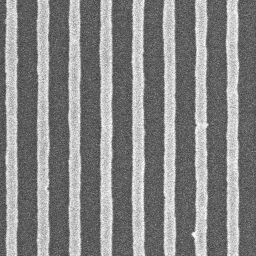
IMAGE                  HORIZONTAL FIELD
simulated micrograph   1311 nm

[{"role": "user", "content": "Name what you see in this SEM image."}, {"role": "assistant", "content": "parallel lines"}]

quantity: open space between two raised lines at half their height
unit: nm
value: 108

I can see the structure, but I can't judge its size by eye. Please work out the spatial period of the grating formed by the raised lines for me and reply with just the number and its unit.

0.162 microns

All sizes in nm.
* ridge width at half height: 56.3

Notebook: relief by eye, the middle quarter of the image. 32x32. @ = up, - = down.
-@@@-----@@@-----@@@-----@@@----
-@@@-----@@@-----@@@-----@@@----
-@@@-----@@@-----@@@-----@@@----
-@@@-----@@@-----@@@-----@@@----
-@@@-----@@@-----@@@-----@@@----
-@@@-----@@@-----@@@-----@@@----
-@@@-----@@@-----@@@-----@@@----
-@@@-----@@@-----@@@-----@@@----
-@@@-----@@@-----@@@-----@@@----
-@@@-----@@@-----@@@-----@@@----
-@@@-----@@@-----@@@-----@@@----
-@@@-----@@@-----@@@-----@@@----
-@@@-----@@@-----@@@-----@@@----
-@@@-----@@@-----@@@-----@@@----
-@@@-----@@@-----@@@-----@@-----
-@@@-----@@@-----@@@-----@@-----
-@@@-----@@@-----@@@-----@@@----
-@@@-----@@@-----@@@-----@@@----
-@@@-----@@@-----@@@-----@@@----
-@@@-----@@@-----@@@-----@@@----
-@@@-----@@@-----@@@-----@@@----
-@@@-----@@@-----@@@-----@@@----
-@@@-----@@@-----@@@-----@@@----
-@@@-----@@@-----@@@-----@@@----
-@@@-----@@@-----@@@-----@@-----
-@@@-----@@@-----@@@-----@@@----
-@@@-----@@@-----@@@-----@@@----
-@@@-----@@@-----@@@-----@@@----
-@@@-----@@@-----@@@-----@@@----
-@@@-----@@@-----@@@-----@@@----
-@@@-----@@@-----@@@-----@@-----
-@@@-----@@@-----@@@-----@@-----